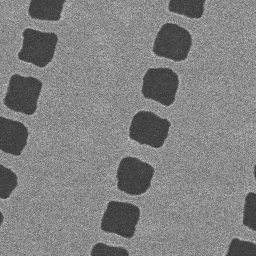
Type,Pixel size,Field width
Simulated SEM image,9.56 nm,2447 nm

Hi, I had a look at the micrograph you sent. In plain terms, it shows holes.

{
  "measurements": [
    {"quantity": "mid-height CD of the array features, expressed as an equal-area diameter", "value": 359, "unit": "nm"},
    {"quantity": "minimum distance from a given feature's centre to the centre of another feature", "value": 432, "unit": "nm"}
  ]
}